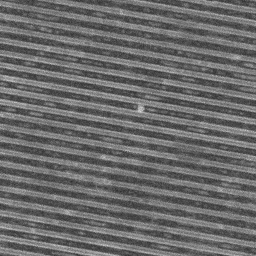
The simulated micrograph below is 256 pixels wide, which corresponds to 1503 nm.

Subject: parallel lines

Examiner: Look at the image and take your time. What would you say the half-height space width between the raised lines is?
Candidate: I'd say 0.0455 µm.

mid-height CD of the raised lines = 25.3 nanometers